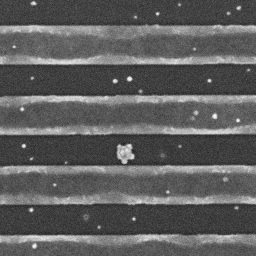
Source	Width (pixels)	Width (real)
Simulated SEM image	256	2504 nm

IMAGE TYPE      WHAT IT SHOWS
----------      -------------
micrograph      lines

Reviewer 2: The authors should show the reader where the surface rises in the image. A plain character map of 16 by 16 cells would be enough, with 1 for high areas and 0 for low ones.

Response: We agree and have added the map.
0000000000000000
0000000000000000
1111111111111111
1111111111111111
0000000000000000
0000000000000000
1111111111111111
1111111111111111
0000000000000000
0000000000000000
0000000000000000
1111111111111111
1011110011111101
0000000000000000
0000000000000000
1111111111111111